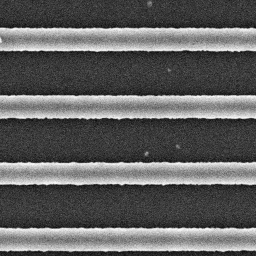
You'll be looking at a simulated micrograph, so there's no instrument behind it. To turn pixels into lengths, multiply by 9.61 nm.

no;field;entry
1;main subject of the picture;lines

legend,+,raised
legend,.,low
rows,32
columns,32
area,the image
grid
................................
................................
................................
................................
++++++++++++++++++++++++++++++++
++++++++++++++++++++++++++++++++
................................
................................
................................
................................
................................
................................
++++++++++++++++++++++++++++++++
++++++++++++++++++++++++++++++++
++++++++++++++++++++++++++++++++
................................
................................
................................
................................
................................
++++++++++++++++++++++++++++++++
++++++++++++++++++++++++++++++++
++++++++++++++++++++++++++++++++
................................
................................
................................
................................
................................
................................
++++++++++++++++++++++++++++++++
++++++++++++++++++++++++++++++++
................................